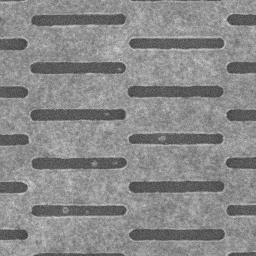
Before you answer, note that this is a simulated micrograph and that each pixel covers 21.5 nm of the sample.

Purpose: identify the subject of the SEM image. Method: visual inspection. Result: a regular array of holes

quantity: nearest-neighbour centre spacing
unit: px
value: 47.6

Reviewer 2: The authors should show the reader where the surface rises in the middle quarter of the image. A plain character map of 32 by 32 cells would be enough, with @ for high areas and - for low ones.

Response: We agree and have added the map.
---------------@@@@@@@@@@@@@@@@@
---------------@@@@@@@@@@@@@@@@@
----@@@-@@----@@@@@@@@@@@@@@@@@@
@@@@@@@@@@@@@@@@@@@@@@@@@@@@@@@@
@@@@@@@@@@@@@@@@@@@@@@@@@@@@@@@@
@@@@@@@@@@@@@@@@@------------@@@
@@@@@@@@@@@@@@@@----------------
@@@@@@@@@@@@@@@@----------------
@@@@@@@@@@@@@@@@@@----@@@@----@@
@@@@@@@@@@@@@@@@@@@@@@@@@@@@@@@@
@@@@@@@@@@@@@@@@@@@@@@@@@@@@@@@@
---------------@@@@@@@@@@@@@@@@@
----------------@@@@@@@@@@@@@@@@
---------------@@@@@@@@@@@@@@@@@
@@@@@@@@@@@@@@@@@@@@@@@@@@@@@@@@
@@@@@@@@@@@@@@@@@@@@@@@@@@@@@@@@
@@@@@@@@@@@@@@@@@@@@@@@@@@@@@@@@
@@@@@@@@@@@@@@@@@---------------
@@@@@@@@@@@@@@@@----------------
@@@@@@@@@@@@@@@@----------------
@@@@@@@@@@@@@@@@@@@@@@@@@@@@@@@@
@@@@@@@@@@@@@@@@@@@@@@@@@@@@@@@@
@@@@@@@@@@@@@@@@@@@@@@@@@@@@@@@@
---------------@@@@@@@@@@@@@@@@@
----------------@@@@@@@@@@@@@@@@
---------------@@@@@@@@@@@@@@@@@
@@@@@@@@@@@@@@@@@@@@@@@@@@@@@@@@
@@@@@@@@@@@@@@@@@@@@@@@@@@@@@@@@
@@@@@@@@@@@@@@@@@@@@@@@@@@@@@@@@
@@@@@@@@@@@@@@@@@---------------
@@@@@@@@@@@@@@@@----------------
@@@@@@@@@@@@@@@@----------------